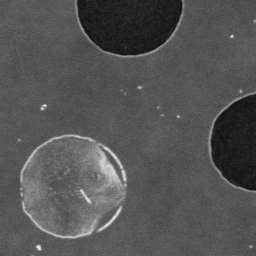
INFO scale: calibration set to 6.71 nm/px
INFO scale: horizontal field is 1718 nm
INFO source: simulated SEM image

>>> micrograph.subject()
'holes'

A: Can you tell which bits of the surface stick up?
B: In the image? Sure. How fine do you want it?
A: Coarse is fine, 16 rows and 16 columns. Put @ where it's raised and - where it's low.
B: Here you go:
@@@@@------@@@@@
@@@@@------@@@@@
@@@@@@----@@@@@@
@@@@@@@@@@@@@@@@
@@@@@@@@@@@@@@@@
@@@@@@@@@@@@@@@@
@@@@@@@@@@@@@@@-
@@@@@@@@@@@@@@--
@@@@@@@@@@@@@---
@@@@@@@@@@@@@---
@@@@@@@@@@@@@@--
@@@@@@@@@@@@@@@-
@@@@@@@@@@@@@@@@
@@@@@@@@@@@@@@@@
@@@@@@@@@@@@@@@@
@@@@@@@@@@@@@@@@